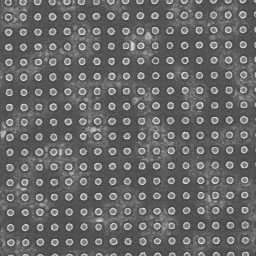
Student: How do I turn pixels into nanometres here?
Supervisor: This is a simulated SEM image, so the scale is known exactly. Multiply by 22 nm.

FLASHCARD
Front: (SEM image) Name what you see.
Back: a regular array of raised bodies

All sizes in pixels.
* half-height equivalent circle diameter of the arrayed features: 6.58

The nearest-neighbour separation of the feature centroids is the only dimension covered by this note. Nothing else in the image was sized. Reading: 314 nm